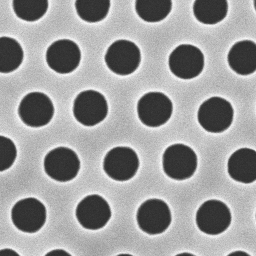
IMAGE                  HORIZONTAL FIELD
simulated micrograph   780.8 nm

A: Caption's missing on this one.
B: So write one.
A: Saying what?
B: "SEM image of a regular array of holes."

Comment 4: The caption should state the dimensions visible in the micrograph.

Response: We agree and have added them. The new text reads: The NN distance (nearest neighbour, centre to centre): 176 nm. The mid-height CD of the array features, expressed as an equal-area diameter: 107 nm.